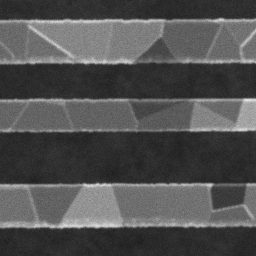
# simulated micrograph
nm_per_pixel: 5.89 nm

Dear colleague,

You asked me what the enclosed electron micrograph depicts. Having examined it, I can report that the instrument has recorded lines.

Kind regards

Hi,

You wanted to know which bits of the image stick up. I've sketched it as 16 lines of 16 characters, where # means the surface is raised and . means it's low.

................
################
################
################
................
................
################
################
................
................
................
................
################
################
................
................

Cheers